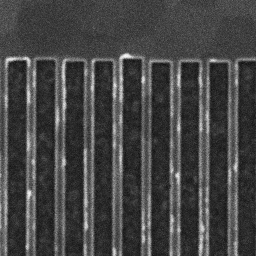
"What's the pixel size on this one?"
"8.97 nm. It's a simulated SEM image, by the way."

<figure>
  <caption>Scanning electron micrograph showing parallel lines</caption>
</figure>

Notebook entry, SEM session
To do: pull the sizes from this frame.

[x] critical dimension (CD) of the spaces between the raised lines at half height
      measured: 179 nm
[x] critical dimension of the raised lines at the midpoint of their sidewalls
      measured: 86.3 nanometres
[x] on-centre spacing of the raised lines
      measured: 259 nanometres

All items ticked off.